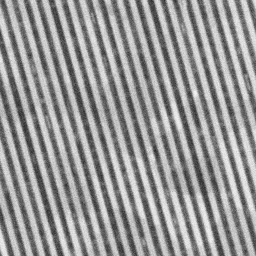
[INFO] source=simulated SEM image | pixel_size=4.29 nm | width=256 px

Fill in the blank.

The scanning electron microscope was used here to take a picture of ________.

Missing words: parallel lines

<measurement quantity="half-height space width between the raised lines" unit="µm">0.0309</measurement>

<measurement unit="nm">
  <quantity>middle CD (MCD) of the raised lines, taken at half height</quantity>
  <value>19.6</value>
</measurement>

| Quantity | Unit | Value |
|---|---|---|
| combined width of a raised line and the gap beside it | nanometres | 51.1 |